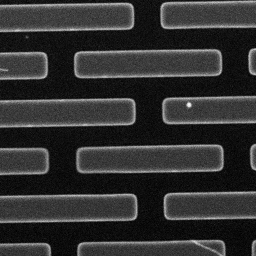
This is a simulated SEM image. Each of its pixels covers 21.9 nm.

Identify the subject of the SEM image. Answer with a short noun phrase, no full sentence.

groups of lines, slits or small figures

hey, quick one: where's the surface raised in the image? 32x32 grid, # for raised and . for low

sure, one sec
.........#######....############
#################...############
#################...############
################................
................................
................................
..............#############....#
######...###################...#
######...###################...#
######....##############........
................................
................................
...........#####.....###########
#################...############
#################...############
################................
................................
................................
.............###############....
######....##################...#
######....##################...#
######....##...####.............
................................
................................
.....############....###########
#################....###########
#################....###########
################................
................................
................................
...###....##################....
######....##################....